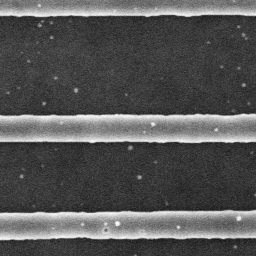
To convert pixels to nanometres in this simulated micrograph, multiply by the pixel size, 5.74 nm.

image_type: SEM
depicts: lines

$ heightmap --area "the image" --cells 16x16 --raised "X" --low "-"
XXXXXXXXXXXXXXXX
----------------
----------------
----------------
----------------
----------------
----------------
XXXXXXXXXXXXXXXX
XXXXXXXXXXXXXXXX
----------------
----------------
----------------
----------------
XXXXXXXXXXXXXXXX
XXXXXXXXXXXXXXXX
----------------